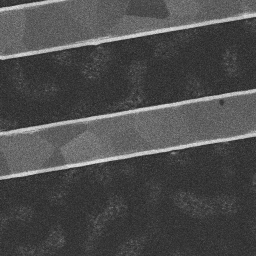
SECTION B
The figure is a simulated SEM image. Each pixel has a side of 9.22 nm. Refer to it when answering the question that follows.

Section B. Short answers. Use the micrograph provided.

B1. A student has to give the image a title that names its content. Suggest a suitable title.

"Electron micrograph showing one or a few lines or trenches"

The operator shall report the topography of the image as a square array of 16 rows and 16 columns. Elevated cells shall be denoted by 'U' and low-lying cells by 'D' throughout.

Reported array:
DUUUUUUUUUUUUUUU
UUUUUUUUUUUUUDDD
UUUUUUUDDDDDDDDD
UDDDDDDDDDDDDDDD
DDDDDDDDDDDDDDDD
DDDDDDDDDDDDDDDD
DDDDDDDDDDDUUUUU
DDDDDUUUUUUUUUUU
UUUUUUUUUUUUUUUU
UUUUUUUUUUDDDDDD
UUUUDDDDDDDDDDDD
DDDDDDDDDDDDDDDD
DDDDDDDDDDDDDDDD
DDDDDDDDDDDDDDDD
DDDDDDDDDDDDDDDD
DDDDDDDDDDDDDDDD